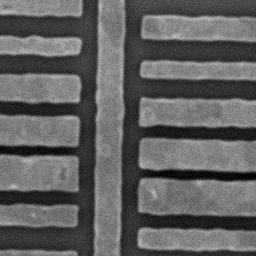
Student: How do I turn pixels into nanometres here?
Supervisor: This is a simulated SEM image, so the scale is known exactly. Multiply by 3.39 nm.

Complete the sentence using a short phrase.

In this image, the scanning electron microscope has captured groups of lines, slits or small figures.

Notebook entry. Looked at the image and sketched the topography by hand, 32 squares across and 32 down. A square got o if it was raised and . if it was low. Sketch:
oooooooooo..ooo.................
oooooooooo..oooo................
............oooo..oooooooooooooo
............oooo..oooooooooooooo
............ooo...oooooooooooooo
oooooooooo..ooo.................
oooooooooo..ooo.................
............ooo.................
............ooo...oooooooooooooo
ooooooooo...ooo...oooooooooooooo
oooooooooo..ooo.................
oooooooooo..ooo.................
oooooooooo..ooo...ooo.o.........
............ooo...oooooooooooooo
o...........ooo..ooooooooooooooo
oooooooooo..ooo...oo.ooooooooooo
oooooooooo..ooo.................
oooooooooo..ooo...ooo...........
............ooo...oooooooooooooo
o...........ooo..ooooooooooooooo
oooooooooo..ooo..ooooooooooooooo
oooooooooo..ooo.................
oooooooooo..ooo...ooo...........
oooooooooo..ooo..ooooooooooooooo
............ooo..ooooooooooooooo
............ooo..ooooooooooooooo
oooooooooo..ooo...oooooooooooooo
oooooooooo..ooo.................
............ooo.................
............ooo..ooooooooooooooo
............ooo..ooooooooooooooo
oooooo..o...ooo.................